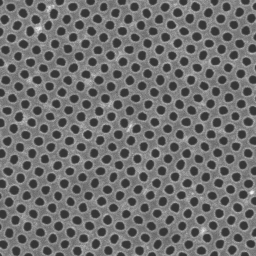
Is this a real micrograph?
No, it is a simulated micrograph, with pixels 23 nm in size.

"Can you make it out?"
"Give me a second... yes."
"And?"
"a regular array of holes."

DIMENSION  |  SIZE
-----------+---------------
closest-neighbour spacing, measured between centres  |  306 nanometers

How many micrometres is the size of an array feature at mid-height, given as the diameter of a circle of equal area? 0.211